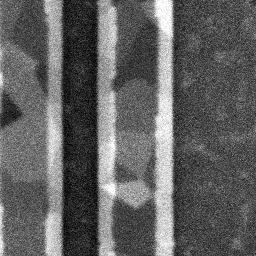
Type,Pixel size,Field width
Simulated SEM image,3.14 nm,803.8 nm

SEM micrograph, one or a few lines or trenches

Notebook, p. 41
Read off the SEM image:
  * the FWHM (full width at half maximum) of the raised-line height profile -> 196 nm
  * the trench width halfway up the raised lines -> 48.1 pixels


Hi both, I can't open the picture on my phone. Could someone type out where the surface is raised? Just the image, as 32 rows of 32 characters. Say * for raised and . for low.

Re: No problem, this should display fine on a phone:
*******......********...........
*******......********...........
*******......********...........
*******......********...........
*******......********...........
*******......********...........
*******......********...........
*******......********...........
*******......********...........
*******......********...........
*******......********...........
*******......********...........
*******......********...........
*******......********...........
*******......********...........
*******......********...........
*******......********...........
*******......********...........
*******......********...........
*******......********...........
*******......********...........
*******......********...........
*******......********...........
*******......********...........
*******......********...........
*******......********...........
*******......********...........
*******......********...........
*******......********...........
*******......********...........
*******......********...........
*******......********...........